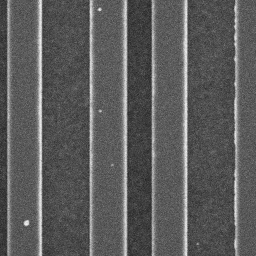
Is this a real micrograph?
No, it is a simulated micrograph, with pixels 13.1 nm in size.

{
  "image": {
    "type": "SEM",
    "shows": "lines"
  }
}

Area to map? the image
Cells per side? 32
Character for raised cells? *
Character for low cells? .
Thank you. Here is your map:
.****......*****...****......***
.****......*****...****......***
.****......*****...****......***
.****......*****...****......***
.****......*****...****......***
.****......*****...****......***
.****......*****...****.......**
.****......*****...****......***
.****......*****...****.......**
.****......*****...****.......**
.****......*****...****......***
.****......*****...****.......**
.****......*****...****......***
.****......*****...****......***
.****......*****...****......***
.****......*****...****......***
.****......*****...****......***
.****......*****...****......***
.****......*****...****.......**
.****......*****...****.......**
.****......*****...****.......**
.****......*****...****......***
.****......*****...****......***
.****......*****...****......***
.****......*****...****......***
.****......*****...****......***
.****......*****...****......***
.****......*****...****......***
.****......*****...****.......**
.****......*****...****.......**
.****......*****...****......***
.****......*****...****.......**